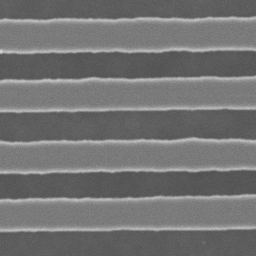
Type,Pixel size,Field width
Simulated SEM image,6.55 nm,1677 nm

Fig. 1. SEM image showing lines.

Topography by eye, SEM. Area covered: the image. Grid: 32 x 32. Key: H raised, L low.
LLLLLLLLLLLLLLLLLLLLLLLLLLLLLLLL
LLLLLLLLLLLLLLLLLLLLLLLLLLLLLLLL
HHHHHLHHHHHHHHHHHHHHHHHHHHHHHHHH
HHHHHHHHHHHHHHHHHHHHHHHHHHHHHHHH
HHHHHHHHHHHHHHHHHHHHHHHHHHHHHHHH
HHHHHHHHHHHHHHHHHHHHHHHHHHHHHHHH
HHHHHHHHHHLHLLLLHLLHLLLLLLLLLLLL
LLLLLLLLLLLLLLLLLLLLLLLLLLLLLLLL
LLLLLLLLLLLLLLLLLLLLLLLLLLLLLLLL
LLLLLLLLLLLLLLLLLLLLLLLLLLLLLLLL
HHHHHHHHHHHHHHHHHHHHHHHHHHHHHHHH
HHHHHHHHHHHHHHHHHHHHHHHHHHHHHHHH
HHHHHHHHHHHHHHHHHHHHHHHHHHHHHHHH
HHHHHHHHHHHHHHHHHHHHHHHHHHHHHHHH
LLLLLLLLLLLLLLLLLLLLLLLLLLLLLLLL
LLLLLLLLLLLLLLLLLLLLLLLLLLLLLLLL
LLLLLLLLLLLLLLLLLLLLLLLLLLLLLLLL
LLLLLLLLLLLLLLLLLHLLLLHHHHHHHHHL
HHHHHHHHHHHHHHHHHHHHHHHHHHHHHHHH
HHHHHHHHHHHHHHHHHHHHHHHHHHHHHHHH
HHHHHHHHHHHHHHHHHHHHHHHHHHHHHHHH
HHHHHHHHHHHLLHLLLLLLLLLLLLLLLLLL
LLLLLLLLLLLLLLLLLLLLLLLLLLLLLLLL
LLLLLLLLLLLLLLLLLLLLLLLLLLLLLLLL
LLLLLLLLLLLLLLLLLLLLLLLHLLHHHHHH
HHHHHHHHHHHHHHHHHHHHHHHHHHHHHHHH
HHHHHHHHHHHHHHHHHHHHHHHHHHHHHHHH
HHHHHHHHHHHHHHHHHHHHHHHHHHHHHHHH
HHHHHHHHHHHHHHHHHHHHHHHHHHHHHHHH
LLLLLLLLLLLLLLLLLLLLLLLLLLLLLLLL
LLLLLLLLLLLLLLLLLLLLLLLLLLLLLLLL
LLLLLLLLLLLLLLLLLLLLLLLLLLLLLLLL